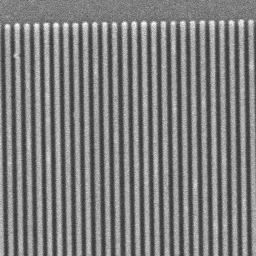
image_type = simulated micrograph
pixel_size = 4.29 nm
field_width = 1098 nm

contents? parallel lines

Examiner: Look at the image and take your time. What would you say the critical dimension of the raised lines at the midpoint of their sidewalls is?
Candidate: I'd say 21.4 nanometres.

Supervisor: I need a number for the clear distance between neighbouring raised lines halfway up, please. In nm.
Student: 21.4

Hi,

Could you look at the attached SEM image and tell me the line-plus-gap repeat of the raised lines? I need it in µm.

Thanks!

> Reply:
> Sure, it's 0.0418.